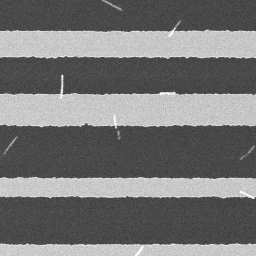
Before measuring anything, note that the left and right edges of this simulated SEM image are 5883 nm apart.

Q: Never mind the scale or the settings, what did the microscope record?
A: one or a few lines or trenches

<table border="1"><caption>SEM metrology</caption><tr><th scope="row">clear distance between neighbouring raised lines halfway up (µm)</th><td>1.09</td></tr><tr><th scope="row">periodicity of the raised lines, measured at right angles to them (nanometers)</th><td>1650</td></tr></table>